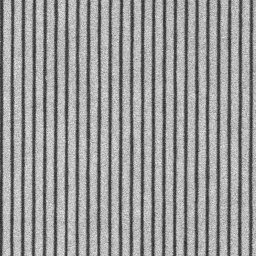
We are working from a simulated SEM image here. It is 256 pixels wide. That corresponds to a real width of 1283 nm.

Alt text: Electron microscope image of parallel lines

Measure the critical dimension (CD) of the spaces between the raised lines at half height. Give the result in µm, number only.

0.0175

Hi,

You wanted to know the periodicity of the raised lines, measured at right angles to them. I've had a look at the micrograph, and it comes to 54.3 nm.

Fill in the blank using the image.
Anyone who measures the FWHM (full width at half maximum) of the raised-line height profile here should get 39.4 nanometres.